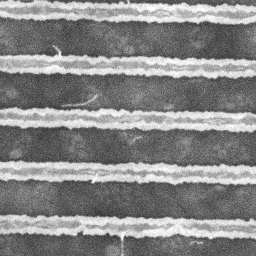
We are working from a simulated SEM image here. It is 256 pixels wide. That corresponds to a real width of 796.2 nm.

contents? parallel lines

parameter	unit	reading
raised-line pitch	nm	166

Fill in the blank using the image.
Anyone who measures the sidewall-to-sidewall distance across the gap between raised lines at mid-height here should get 121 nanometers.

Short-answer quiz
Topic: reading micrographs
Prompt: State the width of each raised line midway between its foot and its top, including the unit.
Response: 45.1 nm